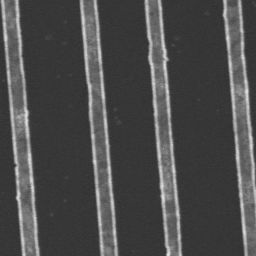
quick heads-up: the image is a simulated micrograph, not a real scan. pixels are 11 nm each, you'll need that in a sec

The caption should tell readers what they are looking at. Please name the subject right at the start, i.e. one or a few lines or trenches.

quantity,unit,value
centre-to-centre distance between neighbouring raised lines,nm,808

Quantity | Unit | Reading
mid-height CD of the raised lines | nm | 154